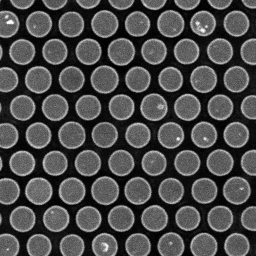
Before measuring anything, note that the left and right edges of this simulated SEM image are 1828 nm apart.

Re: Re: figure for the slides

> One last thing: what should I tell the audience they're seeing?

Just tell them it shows a regular array of raised bodies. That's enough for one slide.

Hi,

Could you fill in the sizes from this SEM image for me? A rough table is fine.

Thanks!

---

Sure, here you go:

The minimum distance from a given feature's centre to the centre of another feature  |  228 nm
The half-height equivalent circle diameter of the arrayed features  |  183 nanometers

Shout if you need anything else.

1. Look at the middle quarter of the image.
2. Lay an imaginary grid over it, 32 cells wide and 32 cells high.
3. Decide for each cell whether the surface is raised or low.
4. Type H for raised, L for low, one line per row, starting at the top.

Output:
LLLLLLLLLLLLLLLLLLLLLLLLLLLLLLLL
HHHHLLLLHHHHHLLLHHHHLLLLLHHHLLLL
HHHHHLLHHHHHHLLLHHHHHLLLHHHHHLLL
HHHHHLLHHHHHHHLLHHHHHLLLHHHHHHLL
HHHHHLLHHHHHHHLLHHHHHLLLHHHHHHLL
HHHHHLLHHHHHHLLLHHHHHLLLHHHHHLLL
HHHLLLLLHHHHLLLLLHHHLLLLLHHHLLLL
LLLLLLLLLLLLLLLLLLLLLLLLLLLLLLLL
LLLLHHHHLLLLHHHHHLLLHHHHHLLLLHHH
HLLHHHHHHLLLHHHHHLLLHHHHHLLLHHHH
HLLHHHHHHLLHHHHHHLLHHHHHHHLLHHHH
HLLHHHHHHLLHHHHHHLLHHHHHHHLLHHHH
HLLHHHHHHLLLHHHHHLLLHHHHHLLLHHHH
LLLLHHHHLLLLLHHHLLLLLHHHHLLLLHHH
LLLLLLLLLLLLLLLLLLLLLLLLLLLLLLLL
HHHHHLLLHHHHLLLLHHHHHLLLHHHHHLLL
HHHHHLLHHHHHHLLLHHHHHLLLHHHHHHLL
HHHHHLLHHHHHHLLHHHHHHHLLHHHHHHLL
HHHHHLLHHHHHHLLHHHHHHHLLHHHHHHLL
HHHHHLLLHHHHHLLLHHHHHLLLHHHHHLLL
HHHHLLLLLHHHLLLLLHHHLLLLLHHHLLLL
LLLLLLLLLLLLLLLLLLLLLLLLLLLLLLLL
LLLLHHHHLLLLHHHHLLLLHHHHHLLLLHHH
LLLHHHHHHLLHHHHHHLLLHHHHHLLLHHHH
HLLHHHHHHLLHHHHHHLLLHHHHHLLLHHHH
HLLHHHHHHLLHHHHHHLLLHHHHHLLLHHHH
LLLHHHHHHLLLHHHHHLLLHHHHHLLLHHHH
LLLLHHHHLLLLLHHHLLLLLHHHLLLLLHHH
LHHLLLLLLHHHLLLLLHHHLLLLLLLLLLLL
HHHHLLLLHHHHHLLLHHHHHLLLLHHHHLLL
HHHHHLLHHHHHHLLHHHHHHHLLHHHHHHLL
HHHHHLLHHHHHHHLHHHHHHHLLHHHHHHLL